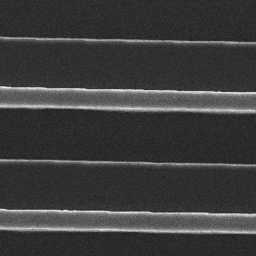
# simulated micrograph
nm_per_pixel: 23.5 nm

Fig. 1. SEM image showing lines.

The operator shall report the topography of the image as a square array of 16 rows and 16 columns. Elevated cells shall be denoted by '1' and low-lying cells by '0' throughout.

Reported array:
0000000000000000
0000000000000000
1110000000000000
1111111111111111
1111111111111111
1111111111111111
1111111111111111
0000000000000000
0000000000000000
0000000000000000
1111111111111111
1111111111111111
1111111111111111
1111111111111111
0000000000000111
0000000000000000